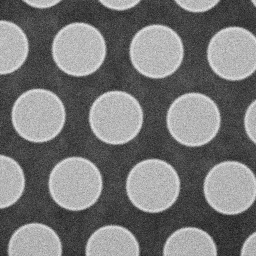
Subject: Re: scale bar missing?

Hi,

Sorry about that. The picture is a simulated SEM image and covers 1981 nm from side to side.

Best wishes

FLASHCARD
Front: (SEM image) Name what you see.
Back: an array of small figures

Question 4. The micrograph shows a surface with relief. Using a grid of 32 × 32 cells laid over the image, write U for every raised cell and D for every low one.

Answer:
DDDDUUUDDDDDDUUUUDDDDDUUUUUDDDDD
DDDDDDDDDDDDDDDDDDDDDDDDDDDDDDDD
DDDDDDDDDDDDDDDDDDDDDDDDDDDDDDDD
UUDDDDDDUUUUDDDDDDUUUDDDDDDDDUDD
UUUDDDDUUUUUUDDDDUUUUUDDDDDUUUUU
UUUDDDDUUUUUUDDDUUUUUUUDDDUUUUUU
UUUDDDDUUUUUUDDDUUUUUUUDDDUUUUUU
UUUDDDDUUUUUUDDDUUUUUUUDDDUUUUUU
UUDDDDDDUUUUDDDDDUUUUUDDDDUUUUUU
DDDDDDDDDDDDDDDDDDUUUDDDDDDDUUUD
DDDDDDDDDDDDDDDDDDDDDDDDDDDDDDDD
DDDUUUDDDDDDDDUDDDDDDDDDDDDDDDDD
DDUUUUUDDDDDUUUUUDDDDDUUUUDDDDDD
DDUUUUUUDDDDUUUUUDDDDUUUUUUDDDDU
DDUUUUUUDDDUUUUUUUDDDUUUUUUDDDDU
DDUUUUUUDDDUUUUUUUDDDUUUUUUDDDDU
DDUUUUUDDDDDUUUUUDDDDUUUUUUDDDDU
DDDDUUDDDDDDDUUUDDDDDDUUUUDDDDDD
DDDDDDDDDDDDDDDDDDDDDDDDDDDDDDDD
DDDDDDDDDDDDDDDDDDDDDDDDDDDDDDDD
UUDDDDDUUUUUDDDDDUUUUDDDDDDUUUDD
UUUDDDDUUUUUDDDDUUUUUUDDDDUUUUUD
UUUDDDUUUUUUUDDDUUUUUUDDDDUUUUUU
UUUDDDUUUUUUUDDDUUUUUUDDDDUUUUUU
UUDDDDDUUUUUDDDDUUUUUUDDDDUUUUUU
UDDDDDDUUUUUDDDDDUUUUDDDDDUUUUUD
DDDDDDDDDDDDDDDDDDDDDDDDDDDDUUDD
DDDDDDDDDDDDDDDDDDDDDDDDDDDDDDDD
DDDUUUDDDDDDDUUDDDDDDDDDDDDDDDDD
DDUUUUUDDDDUUUUUUDDDDUUUUUDDDDDU
DUUUUUUUDDDUUUUUUDDDDUUUUUUDDDDU
DUUUUUUUDDDUUUUUUDDDDUUUUUUDDDUU